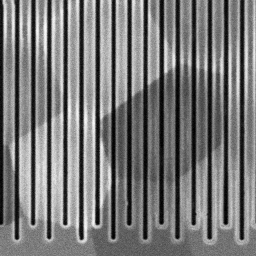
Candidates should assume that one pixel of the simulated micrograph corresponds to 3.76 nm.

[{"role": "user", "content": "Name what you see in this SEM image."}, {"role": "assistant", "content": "parallel lines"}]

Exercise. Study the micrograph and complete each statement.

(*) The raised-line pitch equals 0.0603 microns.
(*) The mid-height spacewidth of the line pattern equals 19.7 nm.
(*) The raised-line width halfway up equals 0.0423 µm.